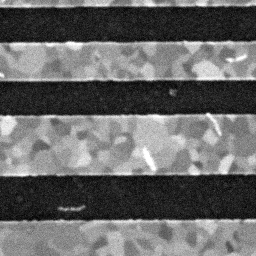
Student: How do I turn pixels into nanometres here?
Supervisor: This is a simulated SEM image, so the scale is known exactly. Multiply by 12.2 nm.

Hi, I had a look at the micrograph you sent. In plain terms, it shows lines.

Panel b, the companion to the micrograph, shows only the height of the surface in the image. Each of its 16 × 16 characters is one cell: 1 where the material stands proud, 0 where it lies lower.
0000000000000000
0000000000000000
0000000000000000
1111111111111111
1111111111111111
0000000000000000
0000000000000000
1111111111111111
1111111111111111
1111111111111111
1111111111111111
0000000000000000
0000000000000000
0000000000000000
1111111111111111
1111111111111111